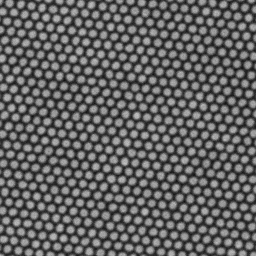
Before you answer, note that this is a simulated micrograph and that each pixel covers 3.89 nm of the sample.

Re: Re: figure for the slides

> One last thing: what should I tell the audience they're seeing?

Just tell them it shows a regular array of raised bodies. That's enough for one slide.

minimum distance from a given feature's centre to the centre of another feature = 0.0403 microns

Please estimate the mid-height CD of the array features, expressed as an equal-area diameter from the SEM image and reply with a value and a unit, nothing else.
7.4 px